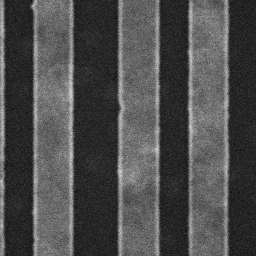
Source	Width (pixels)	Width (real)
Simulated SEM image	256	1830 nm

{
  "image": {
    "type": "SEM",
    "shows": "one or a few lines or trenches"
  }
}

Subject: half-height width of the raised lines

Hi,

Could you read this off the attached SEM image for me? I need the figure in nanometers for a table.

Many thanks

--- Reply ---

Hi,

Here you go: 264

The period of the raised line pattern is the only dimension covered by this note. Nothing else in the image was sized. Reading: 555 nm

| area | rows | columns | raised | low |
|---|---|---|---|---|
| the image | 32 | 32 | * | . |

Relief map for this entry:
....*****......*****....****....
....*****......*****....****....
.....****......*****....****....
.....****......*****....****....
.....****......*****....****....
.....****......*****....****....
.....****......*****....****....
.....****......*****....****....
.....****......*****....****....
.....****......*****....****....
.....****......*****....****....
.....****......*****....****....
.....****......*****....****....
.....****......*****....****....
.....****......*****....****....
....*****......*****....****....
.....****......*****....****....
.....****......*****....****....
.....****......*****....****....
....*****......*****....****....
.....****......*****....****....
.....****......*****....****....
.....****......*****....****....
.....****......*****....****....
.....****......*****....****....
.....****......*****....****....
....*****......*****....****....
....*****......*****....****....
....*****......*****....****....
....*****......*****....****....
....*****......*****....****....
....*****......*****....****....